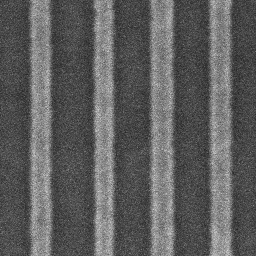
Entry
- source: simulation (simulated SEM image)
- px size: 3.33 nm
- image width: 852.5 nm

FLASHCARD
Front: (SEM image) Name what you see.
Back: parallel lines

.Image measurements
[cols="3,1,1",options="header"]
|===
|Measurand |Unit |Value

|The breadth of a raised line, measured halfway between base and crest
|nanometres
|57.7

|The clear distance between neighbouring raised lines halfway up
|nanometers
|137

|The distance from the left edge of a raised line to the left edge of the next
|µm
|0.2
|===